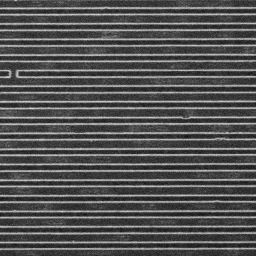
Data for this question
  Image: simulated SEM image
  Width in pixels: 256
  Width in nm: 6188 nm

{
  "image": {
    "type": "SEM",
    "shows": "parallel lines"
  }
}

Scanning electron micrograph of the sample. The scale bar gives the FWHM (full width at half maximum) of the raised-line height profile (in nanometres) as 145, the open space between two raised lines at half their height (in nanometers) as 230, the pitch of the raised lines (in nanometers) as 377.